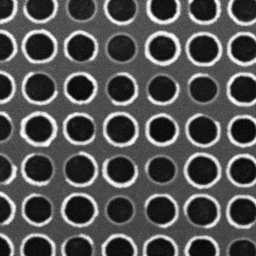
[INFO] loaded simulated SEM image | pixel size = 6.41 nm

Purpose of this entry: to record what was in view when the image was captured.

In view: a regular array of holes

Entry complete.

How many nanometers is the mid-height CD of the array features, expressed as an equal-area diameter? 178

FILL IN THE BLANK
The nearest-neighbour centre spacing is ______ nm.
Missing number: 259